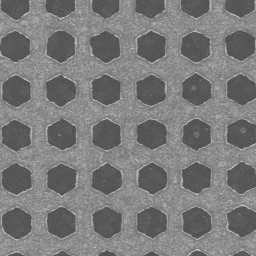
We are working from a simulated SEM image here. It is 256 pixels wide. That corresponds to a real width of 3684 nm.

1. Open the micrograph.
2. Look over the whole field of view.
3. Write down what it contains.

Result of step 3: a regular array of holes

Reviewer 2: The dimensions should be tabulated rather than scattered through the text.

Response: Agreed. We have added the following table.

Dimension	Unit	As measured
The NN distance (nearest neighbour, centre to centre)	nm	628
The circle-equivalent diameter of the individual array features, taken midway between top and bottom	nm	440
